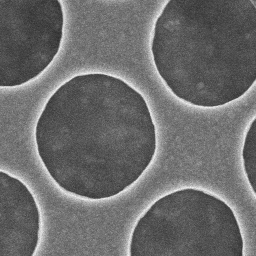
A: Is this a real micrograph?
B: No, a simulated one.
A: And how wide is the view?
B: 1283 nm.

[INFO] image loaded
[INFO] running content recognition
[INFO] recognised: holes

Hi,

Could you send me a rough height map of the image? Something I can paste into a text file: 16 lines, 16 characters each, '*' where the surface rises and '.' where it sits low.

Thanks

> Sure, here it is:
....******......
....******......
....******......
...*******......
...*******......
****....***.....
***......***..**
**.......*******
**........*****.
**........*****.
***......******.
.***....********
..********....**
..*******......*
..******.......*
..******.......*